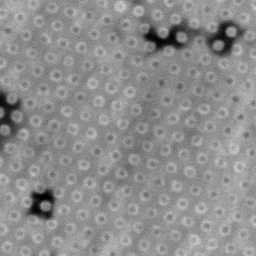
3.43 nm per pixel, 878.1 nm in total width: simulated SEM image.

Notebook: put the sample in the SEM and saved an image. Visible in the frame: a regular array of raised bodies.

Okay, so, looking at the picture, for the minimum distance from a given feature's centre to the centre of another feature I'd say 64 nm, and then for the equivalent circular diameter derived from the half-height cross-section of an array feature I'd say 32.2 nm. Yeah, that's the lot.